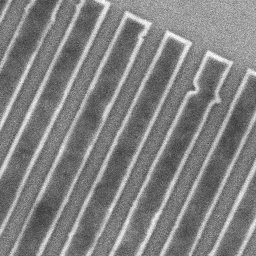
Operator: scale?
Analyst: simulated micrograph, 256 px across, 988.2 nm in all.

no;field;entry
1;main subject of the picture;parallel lines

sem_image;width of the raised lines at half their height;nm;107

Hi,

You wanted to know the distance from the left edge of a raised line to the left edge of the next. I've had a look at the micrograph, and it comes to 173 nm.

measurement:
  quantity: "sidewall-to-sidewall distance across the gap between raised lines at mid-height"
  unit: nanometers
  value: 66.9